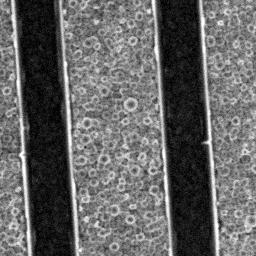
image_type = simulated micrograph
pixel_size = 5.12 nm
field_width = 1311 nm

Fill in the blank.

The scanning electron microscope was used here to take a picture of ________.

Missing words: one or a few lines or trenches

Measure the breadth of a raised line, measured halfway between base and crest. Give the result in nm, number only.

481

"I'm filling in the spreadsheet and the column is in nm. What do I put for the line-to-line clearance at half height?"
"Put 238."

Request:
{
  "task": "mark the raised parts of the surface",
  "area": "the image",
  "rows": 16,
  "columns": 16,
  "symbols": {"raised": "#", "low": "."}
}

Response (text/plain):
#...######...###
#...######...###
#...######...###
#...######...###
#...######...###
#...######...###
#...######...###
#...######...###
#...######...###
#...######...###
##..######...###
##...#####...###
##...#####...###
##...######..###
##...######...##
##...######...##